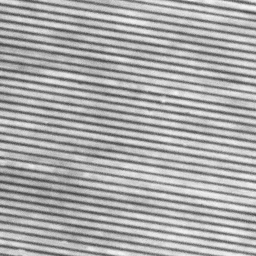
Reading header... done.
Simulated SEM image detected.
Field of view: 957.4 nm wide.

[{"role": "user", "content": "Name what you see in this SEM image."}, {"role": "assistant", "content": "parallel lines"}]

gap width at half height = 14.8 nm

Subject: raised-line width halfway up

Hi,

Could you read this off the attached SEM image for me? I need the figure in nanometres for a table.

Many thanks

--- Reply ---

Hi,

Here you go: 14.8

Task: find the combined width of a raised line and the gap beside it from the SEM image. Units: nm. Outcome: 29.8